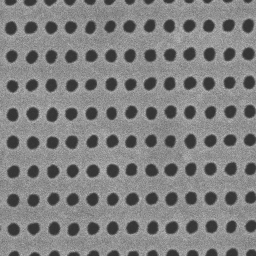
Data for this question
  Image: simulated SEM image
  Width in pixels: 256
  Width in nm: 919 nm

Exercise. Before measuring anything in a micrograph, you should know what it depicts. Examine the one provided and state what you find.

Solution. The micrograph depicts a regular array of holes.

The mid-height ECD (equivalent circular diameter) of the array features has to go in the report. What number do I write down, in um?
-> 0.0451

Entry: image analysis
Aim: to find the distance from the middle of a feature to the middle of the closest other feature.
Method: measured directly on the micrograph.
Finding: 0.07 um